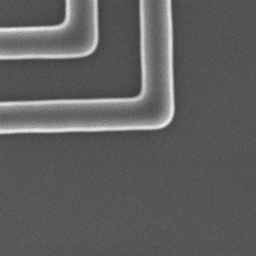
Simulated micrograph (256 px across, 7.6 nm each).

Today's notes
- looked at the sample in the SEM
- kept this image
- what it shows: groups of lines, slits or small figures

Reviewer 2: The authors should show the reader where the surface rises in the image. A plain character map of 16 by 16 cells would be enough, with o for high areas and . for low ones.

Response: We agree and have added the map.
....oo...oo.....
....oo...oo.....
oooooo...oo.....
ooooo....oo.....
.........oo.....
.........oo.....
ooooooooooo.....
ooooooooooo.....
................
................
................
................
................
................
................
................